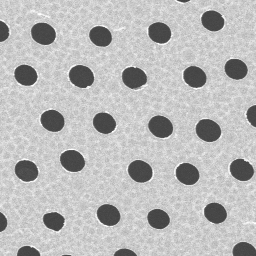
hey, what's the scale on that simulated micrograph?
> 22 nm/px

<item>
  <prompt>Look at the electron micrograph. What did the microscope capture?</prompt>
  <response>a regular array of holes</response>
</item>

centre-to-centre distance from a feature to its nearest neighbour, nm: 1040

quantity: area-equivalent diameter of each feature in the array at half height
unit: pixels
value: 22.6